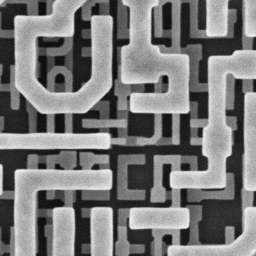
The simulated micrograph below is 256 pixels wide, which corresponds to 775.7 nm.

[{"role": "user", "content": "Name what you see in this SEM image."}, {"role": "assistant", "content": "wiring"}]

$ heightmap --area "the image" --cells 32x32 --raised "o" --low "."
.......ooo......oooo......ooo..o
.......oo.......ooo.......oo...o
..ooooooo..ooo..ooo.......oo...o
..ooooooo..ooo..ooo.......oo...o
..ooo......ooo..ooo.............
..oo.......ooo..ooo.............
..oo........oo.ooooo.........ooo
..oo........oo.ooooooooo..oooooo
..oo.......ooo.ooooooooo..oooooo
..oo.......ooo.ooooo.ooo..oo.ooo
..ooo......ooo.......ooo..oo....
...oooo..oooo........ooo..oo....
...ooooooooo....oooooooo..oo...o
....ooooooo.....oooooooo..oo...o
..........................oo...o
..........................oo...o
.........................oooo..o
oooooooooooooo...........oooo..o
ooooooooooo.o............oooo..o
..........................ooo..o
..........................oo...o
..oooooooooooo........oooooo...o
..oooooooooooo.......ooooooo...o
..oooooooooooo........ooooo....o
..oo............................
..oo............................
..oo...oo..ooo..oooooooo.......o
..oo...oo..ooo..oooooooo.......o
..oo...oo..ooo...oo.ooo........o
..oo...oo..ooo................oo
..oo...oo..ooo...............ooo
..oo...oo..ooo.......ooooooooooo